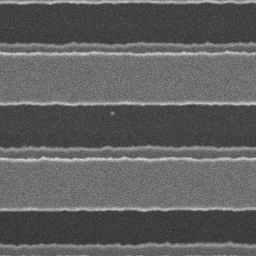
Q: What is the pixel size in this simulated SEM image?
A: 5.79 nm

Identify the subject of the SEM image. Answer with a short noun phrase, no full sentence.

lines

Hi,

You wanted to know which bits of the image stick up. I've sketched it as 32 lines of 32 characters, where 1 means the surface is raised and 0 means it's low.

00000000000000000000000000000000
00000000000000000000000000000000
00000000000000000000000000000000
00000000000000000000000000000000
00000000000000000000000000000000
00000000010000001111010000000111
11111111111111111111111111111111
11111111111111111111111111111111
11111111111111111111111111111111
11111111111111111111111111111111
11111111111111111111111111111111
11111111111111111111111111111111
11111111111111111111111111111111
00000000000000000000000000000000
00000000000000000000000000000000
00000000000000000000000000000000
00000000000000000000000000000000
00000000000000000000000000000000
00011100000001011111110111100111
11111111111111111111111111111111
11111111111111111111111111111111
11111111111111111111111111111111
11111111111111111111111111111111
11111111111111111111111111111111
11111111111111111111111111111111
11111111111111111111111111111111
00000000000000000000000000000000
00000000000000000000000000000000
00000000000000000000000000000000
00000000000000000000000000000000
00000000000000000011100011111100
11111111111111111111111111111111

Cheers